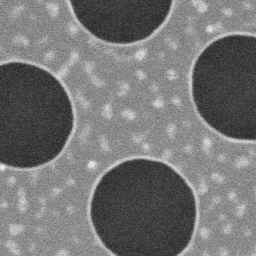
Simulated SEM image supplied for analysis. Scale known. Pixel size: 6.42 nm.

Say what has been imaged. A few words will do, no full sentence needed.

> holes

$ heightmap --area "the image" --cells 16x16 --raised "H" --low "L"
HHHHLLLLLLLHHHHH
HHHHHLLLLLHHHHHH
HHHHHHLLLHHHHLLL
HHHHHHHHHHHHLLLL
LLLHHHHHHHHHLLLL
LLLLHHHHHHHHLLLL
LLLLHHHHHHHHLLLL
LLLLLHHHHHHHHLLL
LLLLHHHHHHHHHHLL
LLLLHHHHHHHHHHHH
HLHHHHHLLLLHHHHH
HHHHHHLLLLLLHHHH
HHHHHHLLLLLLHHHH
HHHHHHLLLLLLHHHH
HHHHHHLLLLLLHHHH
HHHHHHHLLLLLHHHH